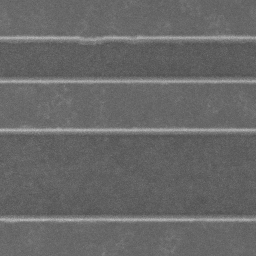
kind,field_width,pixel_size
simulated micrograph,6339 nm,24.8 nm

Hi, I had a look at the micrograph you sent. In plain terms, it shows one or a few lines or trenches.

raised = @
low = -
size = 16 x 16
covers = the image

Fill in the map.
@@@@@@@@@@@@@@@@
@@@@@@@@@@@@@@@@
----------------
----------------
----------------
@@@@@@@@@@@@@@@@
@@@@@@@@@@@@@@@@
@@@@@@@@@@@@@@@@
----------------
----------------
----------------
----------------
----------------
----------------
@@@@@@@@@@@@@@@@
@@@@@@@@@@@@@@@@